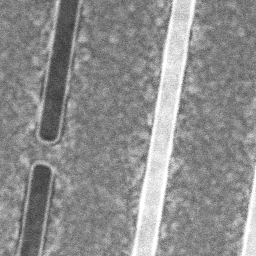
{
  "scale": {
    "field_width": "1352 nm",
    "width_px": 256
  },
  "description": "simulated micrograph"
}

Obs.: one or a few lines or trenches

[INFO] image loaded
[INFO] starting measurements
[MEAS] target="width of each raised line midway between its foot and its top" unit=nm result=104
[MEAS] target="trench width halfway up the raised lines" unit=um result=0.488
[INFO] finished